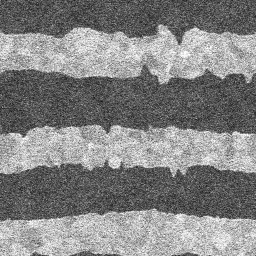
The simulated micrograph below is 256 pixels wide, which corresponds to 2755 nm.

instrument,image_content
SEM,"one or a few lines or trenches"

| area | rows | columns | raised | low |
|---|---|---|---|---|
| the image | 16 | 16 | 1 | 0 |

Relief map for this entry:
0000000000000000
0000000000000000
1111111111111111
1111111111111111
0000111110111111
0000000000000000
0000000000100000
0000000000000000
1111111111111111
1111111111111111
1100000000110011
0000000000000000
0000000000000000
0000011111110000
1111111111111111
1111111111111111